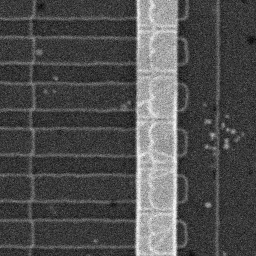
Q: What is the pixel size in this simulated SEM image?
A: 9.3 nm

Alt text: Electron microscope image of wiring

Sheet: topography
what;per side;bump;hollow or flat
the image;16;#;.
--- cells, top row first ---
.........##.....
.........##.....
.........##.....
.........##.....
.........##.....
.........##.....
.........##.....
.........##.....
.........##.....
.........##.....
.........##.....
.........##.....
.........##.....
.........##.....
.........##.....
.........##.....